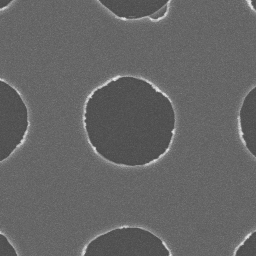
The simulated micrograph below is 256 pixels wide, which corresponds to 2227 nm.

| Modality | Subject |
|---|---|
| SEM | holes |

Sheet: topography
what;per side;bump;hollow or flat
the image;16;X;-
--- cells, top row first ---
XXXXXXX---XXXXXX
XXXXXXXXXXXXXXXX
XXXXXXXXXXXXXXXX
XXXXXXXXXXXXXXXX
XXXXXXXXXXXXXXXX
-XXXXX----XXXXXX
--XXX------XXXX-
--XXX------XXXX-
-XXXXX-----XXXX-
-XXXXX----XXXXXX
XXXXXXXXXXXXXXXX
XXXXXXXXXXXXXXXX
XXXXXXXXXXXXXXXX
XXXXXXXXXXXXXXXX
XXXXXXX--XXXXXXX
-XXXX-----XXXXX-